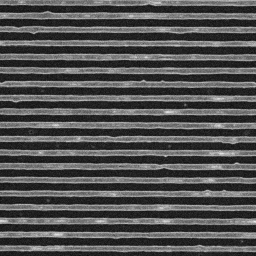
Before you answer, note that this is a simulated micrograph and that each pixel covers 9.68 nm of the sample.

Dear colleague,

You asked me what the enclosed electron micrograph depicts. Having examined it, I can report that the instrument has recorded parallel lines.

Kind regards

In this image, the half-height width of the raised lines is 0.0533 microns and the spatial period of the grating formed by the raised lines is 0.133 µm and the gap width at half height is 0.0775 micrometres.